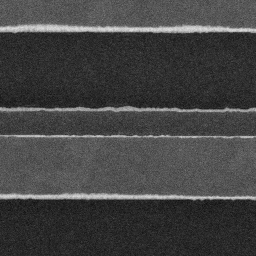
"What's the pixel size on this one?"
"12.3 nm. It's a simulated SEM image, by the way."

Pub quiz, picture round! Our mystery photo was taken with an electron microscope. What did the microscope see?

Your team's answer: lines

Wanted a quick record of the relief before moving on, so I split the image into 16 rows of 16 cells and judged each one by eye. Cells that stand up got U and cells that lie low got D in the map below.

UUUUUUUUUUUUUUUU
UUUUUUUUUUUUUUUU
DDDDDDDDDDDDDDDD
DDDDDDDDDDDDDDDD
DDDDDDDDDDDDDDDD
DDDDDDDDDDDDDDDD
DDDDDDDDDDDDDDDD
UUUUUUUUUUUUUUUU
UUUUUUUUUUUUUUUU
UUUUUUUUUUUUUUUU
UUUUUUUUUUUUUUUU
UUUUUUUUUUUUUUUU
DDDDDDDDDDDDDDDD
DDDDDDDDDDDDDDDD
DDDDDDDDDDDDDDDD
DDDDDDDDDDDDDDDD